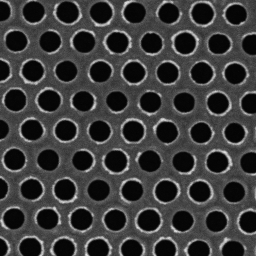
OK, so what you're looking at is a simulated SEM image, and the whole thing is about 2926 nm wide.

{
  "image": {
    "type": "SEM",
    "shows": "a regular array of holes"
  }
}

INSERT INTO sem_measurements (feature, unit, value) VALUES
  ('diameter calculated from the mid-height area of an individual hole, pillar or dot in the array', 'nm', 246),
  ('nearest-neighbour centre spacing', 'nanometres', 384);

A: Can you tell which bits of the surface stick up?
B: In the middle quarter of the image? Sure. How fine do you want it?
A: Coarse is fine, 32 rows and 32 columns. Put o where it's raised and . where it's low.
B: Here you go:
...oooo....oooo.....oooo....oooo
...oooo.....ooo.....ooo......ooo
...oooo.....ooo.....ooo......ooo
...oooo....oooo.....oooo....oooo
.ooooooo..oooooo...ooooo....oooo
oooooooooooooooooooooooooooooooo
oooooooooooooooooooooooooooooooo
ooo....oooo....ooooo...ooooo....
oo.....oooo.....ooo.....oooo....
oo......ooo.....ooo.....ooo.....
oo.....oooo.....ooo.....oooo....
ooo...oooooo...ooooo...ooooo....
oooooooooooooooooooooooooooooooo
oooooooooooooooooooooooooooooooo
..ooooo...oooooo...oooooo.oooooo
...oooo....oooo.....ooo.....oooo
...ooo......ooo.....ooo.....oooo
...ooo......ooo.....ooo......ooo
..ooooo....oooo....oooo.....oooo
ooooooooooooooooo.ooooooo..ooooo
oooooooooooooooooooooooooooooooo
oooooooooooo..ooooooo.oooooooooo
oo.....oooo....oooo.....oooo....
oo.....ooo......ooo.....ooo.....
oo.....ooo......ooo.....ooo.....
oo.....ooo......ooo.....ooo.....
oooo.oooooo....ooooo...ooooo....
oooooooooooooooooooooooooooooooo
oooooooooooooooooooooooooooooooo
..ooooo....ooooo..oooooo...ooooo
...ooo.....oooo....oooo.....oooo
...ooo.....ooo......ooo.....ooo.